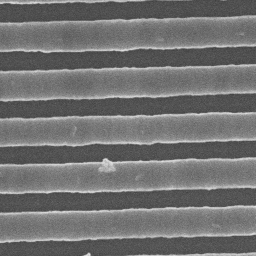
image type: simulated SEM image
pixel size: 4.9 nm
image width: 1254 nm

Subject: lines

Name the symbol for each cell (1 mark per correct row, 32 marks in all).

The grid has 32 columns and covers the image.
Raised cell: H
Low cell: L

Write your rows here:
LLLLLLLLLLLLLLLLLLLLLLLLLLLLLLLL
LLLLLLLLLLLLLLLLLLLLLLLLLLLLLLLL
LLLLLLLLLLLLLLHHHHHHHHHHHHHHHHHH
HHHHHHHHHHHHHHHHHHHHHHHHHHHHHHHH
HHHHHHHHHHHHHHHHHHHHHHHHHHHHHHHH
HHHHHHHHHHHHHHHHHHHHHHHHHHHHHHHH
LLLLLHHLLLLLLLLLLLLLLLLLLLLLLLLL
LLLLLLLLLLLLLLLLLLLLLLLLLLLLLLLL
LLLLLLLLLLLLLLLHLLHHHHHHHHHHHHHH
HHHHHHHHHHHHHHHHHHHHHHHHHHHHHHHH
HHHHHHHHHHHHHHHHHHHHHHHHHHHHHHHH
HHHHHHHHHHHHHHHHHHHHHHHHHHHHHHHH
HHHHLLLLLLLLLLLLLLLLLLLLLLLLLLLL
LLLLLLLLLLLLLLLLLLLLLLLLLLLLLLLL
LLLLLLLLLLLLLLLLLHLHHHHHHHHHHHHH
HHHHHHHHHHHHHHHHHHHHHHHHHHHHHHHH
HHHHHHHHHHHHHHHHHHHHHHHHHHHHHHHH
HHHHHHHHHHHHHHHHHHHHHHHHHHHHHLLL
LLLLLLLLLLLLLLLLLLLLLLLLLLLLLLLL
LLLLLLLLLLLLLLLLLLLLLLLLLLLLLLLL
LLLLLLLLHHHHHHHHHHHHHHHHHHHHHHHH
HHHHHHHHHHHHHHHHHHHHHHHHHHHHHHHH
HHHHHHHHHHHHHHHHHHHHHHHHHHHHHHHH
HHHHHHHHHHHHHHHHHHHHHHHHHHHLLLLL
LLLLLLLLLLLLLLLLLLLLLLLLLLLLLLLL
LLLLLLLLLLLLLLLLLLLLLLLLLLLLLLLL
LLLLLLHHHHHHHHHHHHHHHHHHHHHHHHHH
HHHHHHHHHHHHHHHHHHHHHHHHHHHHHHHH
HHHHHHHHHHHHHHHHHHHHHHHHHHHHHHHH
HHHHHHHHHHHHHHHHHHHHHHLHLLLLLLLL
LLLLLLLLLLLLLLLLLLLLLLLLLLLLLLLL
LLLLLLLLLLLLLLLLLLLLLLLLLLLLLLLL